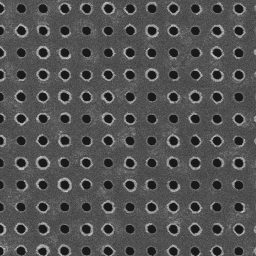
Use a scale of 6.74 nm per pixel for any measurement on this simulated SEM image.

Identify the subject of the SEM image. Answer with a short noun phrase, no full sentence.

a regular array of holes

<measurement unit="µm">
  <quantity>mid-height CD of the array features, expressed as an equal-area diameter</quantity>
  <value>0.0599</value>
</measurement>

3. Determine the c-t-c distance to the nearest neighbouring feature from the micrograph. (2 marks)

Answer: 0.146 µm